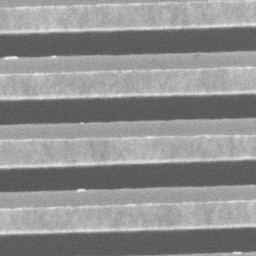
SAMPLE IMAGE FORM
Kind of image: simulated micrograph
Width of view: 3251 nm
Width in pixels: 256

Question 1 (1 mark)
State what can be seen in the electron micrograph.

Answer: lines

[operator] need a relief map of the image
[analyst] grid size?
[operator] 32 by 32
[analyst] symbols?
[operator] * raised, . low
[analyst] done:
********************************
********************************
********************************
*************************.......
................................
................................
...............................*
********************************
********************************
********************************
********************************
********************************
................................
................................
................................
..........**********************
********************************
********************************
********************************
********************************
***************.................
................................
................................
......................**********
********************************
********************************
********************************
********************************
***************************.....
................................
................................
................................